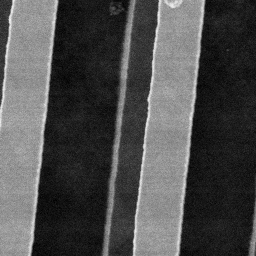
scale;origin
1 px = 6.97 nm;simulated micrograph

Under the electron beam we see lines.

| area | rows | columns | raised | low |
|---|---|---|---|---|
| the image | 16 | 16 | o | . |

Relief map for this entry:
oooo....ooooo...
ooo.....ooooo...
ooo.....ooooo...
ooo.....oooo....
ooo.....oooo....
ooo.....oooo....
ooo.....oooo....
ooo.....oooo....
ooo....ooooo....
ooo....ooooo....
ooo....ooooo....
oo.....ooooo....
oo.....ooooo....
oo.....oooo.....
oo.....oooo.....
oo.....oooo.....